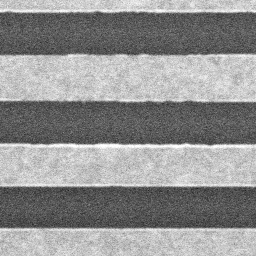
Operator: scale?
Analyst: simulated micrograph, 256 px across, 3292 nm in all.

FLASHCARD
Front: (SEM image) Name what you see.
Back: lines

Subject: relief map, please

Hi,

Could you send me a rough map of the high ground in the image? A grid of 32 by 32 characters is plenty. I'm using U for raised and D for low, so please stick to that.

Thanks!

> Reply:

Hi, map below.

UUUUUUUUUUUUUUUUUUUUUUUUUUUUUUUU
DDDDDDDDDDDDDDDDDDDDDDDDDDDDDDDD
DDDDDDDDDDDDDDDDDDDDDDDDDDDDDDDD
DDDDDDDDDDDDDDDDDDDDDDDDDDDDDDDD
DDDDDDDDDDDDDDDDDDDDDDDDDDDDDDDD
DDDDDDDDDDDDDDDDDDDDDDDDDDDDDDDD
DDDDDDDDDDDDDDDDDDDDDDDDDDDDDDDD
UUUUUUUUUUUUUUUUUUUUUUUUUUUUUUUU
UUUUUUUUUUUUUUUUUUUUUUUUUUUUUUUU
UUUUUUUUUUUUUUUUUUUUUUUUUUUUUUUU
UUUUUUUUUUUUUUUUUUUUUUUUUUUUUUUU
UUUUUUUUUUUUUUUUUUUUUUUUUUUUUUUU
DDDDDDDDDDUDDDDUUUUUUUUDUUUUUUUU
DDDDDDDDDDDDDDDDDDDDDDDDDDDDDDDD
DDDDDDDDDDDDDDDDDDDDDDDDDDDDDDDD
DDDDDDDDDDDDDDDDDDDDDDDDDDDDDDDD
DDDDDDDDDDDDDDDDDDDDDDDDDDDDDDDD
DDDDDDDDDDDDDDDDDDDDDDDDDDDDDDDD
UUUUUUUUUUUUUUUUUUUUUUUUUUUUUUUU
UUUUUUUUUUUUUUUUUUUUUUUUUUUUUUUU
UUUUUUUUUUUUUUUUUUUUUUUUUUUUUUUU
UUUUUUUUUUUUUUUUUUUUUUUUUUUUUUUU
UUUUUUUUUUUUUUUUUUUUUUUUUUUUUUUU
DDDDDDDDDDDDDDDDDDDDDDDDDDDDDDDD
DDDDDDDDDDDDDDDDDDDDDDDDDDDDDDDD
DDDDDDDDDDDDDDDDDDDDDDDDDDDDDDDD
DDDDDDDDDDDDDDDDDDDDDDDDDDDDDDDD
DDDDDDDDDDDDDDDDDDDDDDDDDDDDDDDD
DDDDDDDDDDDDDDDDDDDDDDDDDDDDDDDD
UUUUUUUUUUUUUUUUUUUUUUUUUUUUUUUU
UUUUUUUUUUUUUUUUUUUUUUUUUUUUUUUU
UUUUUUUUUUUUUUUUUUUUUUUUUUUUUUUU